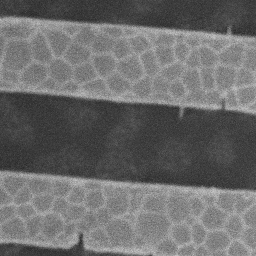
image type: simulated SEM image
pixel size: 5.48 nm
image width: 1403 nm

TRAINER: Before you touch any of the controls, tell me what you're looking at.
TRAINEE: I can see one or a few lines or trenches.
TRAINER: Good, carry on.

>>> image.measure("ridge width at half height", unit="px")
71.4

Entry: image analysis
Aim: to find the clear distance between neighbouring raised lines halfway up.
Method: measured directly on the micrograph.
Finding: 455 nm